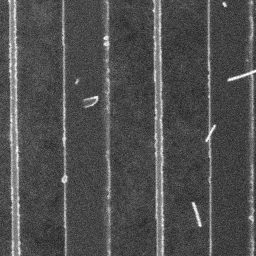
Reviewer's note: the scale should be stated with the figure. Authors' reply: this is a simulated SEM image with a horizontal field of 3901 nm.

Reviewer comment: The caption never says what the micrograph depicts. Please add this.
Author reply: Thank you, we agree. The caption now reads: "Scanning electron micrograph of lines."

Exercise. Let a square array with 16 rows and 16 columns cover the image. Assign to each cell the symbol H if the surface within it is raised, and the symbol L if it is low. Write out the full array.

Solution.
LLLLHHHLLLLLLHHH
LLLLHHHLLLLLLHHH
LLLLHHHLLLLLLHHH
LLLLHHHLLLLLLHHH
LLLLHHHLLLLLLHHH
LLLLHHHLLLLLLHHH
LLLLHHHLLLLLLHHH
LLLLHHHLLLLLLHHH
LLLLHHHLLLLLLHHH
LLLLHHHLLLLLLHHH
LLLLHHHLLLLLLHHH
LLLLHHHLLLLLLHHH
LLLLHHHLLLLLLHHH
LLLLHHHLLLLLLHHH
LLLLHHHLLLLLLHHH
LLLLHHHLLLLLLHHH